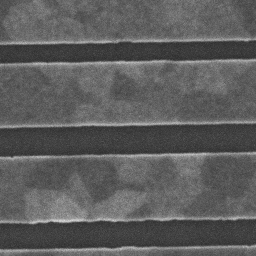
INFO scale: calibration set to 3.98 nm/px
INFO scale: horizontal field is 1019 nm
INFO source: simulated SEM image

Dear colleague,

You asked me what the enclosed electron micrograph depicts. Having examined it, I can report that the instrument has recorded one or a few lines or trenches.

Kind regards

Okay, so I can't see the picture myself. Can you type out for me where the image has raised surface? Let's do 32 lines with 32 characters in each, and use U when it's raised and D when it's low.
UUUUUUUUUUUUUUUUUUUUUUUUUUUUUUUU
UUUUUUUUUUUUUUUUUUUUUUUUUUUUUUUU
UUUUUUUUUUUUUUUUUUUUUUUUUUUUUUUU
UUUUUUUUUUUUUUUUUUUUUUUUUUUUUUUU
UUUUUUUUUUUUUUUUUUUUUUUUUUUUUUUU
DDDDDDDDDDDDDDDDDDDDDDDDDDDDDDDD
DDDDDDDDDDDDDDDDDDDDDDDDDDDDDDDD
DDDDDDDDDDDDDDDDDDDDDDDDDDDDDDDU
UUUUUUUUUUUUUUUUUUUUUUUUUUUUUUUU
UUUUUUUUUUUUUUUUUUUUUUUUUUUUUUUU
UUUUUUUUUUUUUUUUUUUUUUUUUUUUUUUU
UUUUUUUUUUUUUUUUUUUUUUUUUUUUUUUU
UUUUUUUUUUUUUUUUUUUUUUUUUUUUUUUU
UUUUUUUUUUUUUUUUUUUUUUUUUUUUUUUU
UUUUUUUUUUUUUUUUUUUUUUUUUUUUUUUU
UUUUUUUUUUUUUUUUUUUDDDDDDDDDDDDD
DDDDDDDDDDDDDDDDDDDDDDDDDDDDDDDD
DDDDDDDDDDDDDDDDDDDDDDDDDDDDDDDD
DDDDDDDDDDDDDDDDDDDDDDDDDDDDDDDD
DDDDDDDDDDUUUUUUUUUUUUUUUUUUUUUU
UUUUUUUUUUUUUUUUUUUUUUUUUUUUUUUU
UUUUUUUUUUUUUUUUUUUUUUUUUUUUUUUU
UUUUUUUUUUUUUUUUUUUUUUUUUUUUUUUU
UUUUUUUUUUUUUUUUUUUUUUUUUUUUUUUU
UUUUUUUUUUUUUUUUUUUUUUUUUUUUUUUU
UUUUUUUUUUUUUUUUUUUUUUUUUUUUUUUU
UUUUUUUUUUUUUUUUUUUUUUUUUUUUUUUU
UUUUUUUUUUUUUUUUDDDDDDDDDDDDDDDD
DDDDDDDDDDDDDDDDDDDDDDDDDDDDDDDD
DDDDDDDDDDDDDDDDDDDDDDDDDDDDDDDD
DDDDDDDDDDDDDDDDDDDDDDDDDDDDDDDD
UUUUUUUUUUUUUUUUUUUUUUUUUUUUUUUU